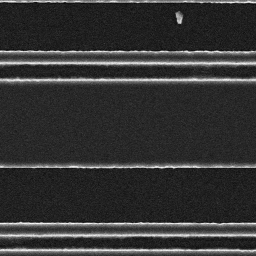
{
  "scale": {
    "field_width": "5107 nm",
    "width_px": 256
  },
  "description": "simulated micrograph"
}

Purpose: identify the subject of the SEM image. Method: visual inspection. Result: lines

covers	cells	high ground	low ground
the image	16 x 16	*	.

................
................
................
****************
****************
****************
****************
****************
****************
****************
................
................
................
................
****************
****************